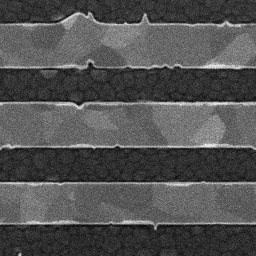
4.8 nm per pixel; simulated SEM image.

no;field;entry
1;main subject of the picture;one or a few lines or trenches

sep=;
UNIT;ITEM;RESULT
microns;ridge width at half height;0.209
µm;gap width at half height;0.172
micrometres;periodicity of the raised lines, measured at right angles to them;0.38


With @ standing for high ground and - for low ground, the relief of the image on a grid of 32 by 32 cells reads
--------------------------------
--------------------------------
--------@@@@------@-------------
@@@@@@@@@@@@@@@@@@@@@@@@@@@@@@@@
@@@@@@@@@@@@@@@@@@@@@@@@@@@@@@@@
@@@@@@@@@@@@@@@@@@@@@@@@@@@@@@@@
@@@@@@@@@@@@@@@@@@@@@@@@@@@@@@@@
@@@@@@@@@@@@@@@@@@@@@@@@@@@@@@@@
-----@@--@@-@-----@----------@@-
--------------------------------
--------------------------------
--------------------------------
--------------------------------
@@@@@@@@@@@@@@@@@@@@@@@@@@@@@@@@
@@@@@@@@@@@@@@@@@@@@@@@@@@@@@@@@
@@@@@@@@@@@@@@@@@@@@@@@@@@@@@@@@
@@@@@@@@@@@@@@@@@@@@@@@@@@@@@@@@
@@@@@@@@@@@@@@@@@@@@@@@@@@@@@@@@
--------------------------------
--------------------------------
--------------------------------
--------------------------------
--------------------------------
@@@@@@@@@@@@@@@@@@@@@@@@@@@@@@@@
@@@@@@@@@@@@@@@@@@@@@@@@@@@@@@@@
@@@@@@@@@@@@@@@@@@@@@@@@@@@@@@@@
@@@@@@@@@@@@@@@@@@@@@@@@@@@@@@@@
@@@@@@@@@@@@@@@@@@@@@@@@@@@@@@@@
--------------------------------
--------------------------------
--------------------------------
--------------------------------